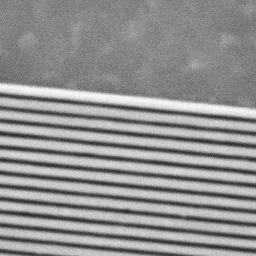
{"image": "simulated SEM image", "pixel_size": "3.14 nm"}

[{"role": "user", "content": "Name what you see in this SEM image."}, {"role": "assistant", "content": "parallel lines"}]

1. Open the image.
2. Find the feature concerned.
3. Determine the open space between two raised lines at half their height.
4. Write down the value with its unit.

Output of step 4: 11.7 nm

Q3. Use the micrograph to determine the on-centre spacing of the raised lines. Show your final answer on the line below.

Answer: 40.7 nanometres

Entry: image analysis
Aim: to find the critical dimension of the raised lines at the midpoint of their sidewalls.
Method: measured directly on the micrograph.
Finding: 28.9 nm